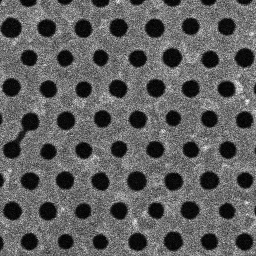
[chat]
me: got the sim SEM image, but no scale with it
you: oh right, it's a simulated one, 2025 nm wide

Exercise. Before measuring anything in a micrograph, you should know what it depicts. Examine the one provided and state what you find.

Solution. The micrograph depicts a regular array of holes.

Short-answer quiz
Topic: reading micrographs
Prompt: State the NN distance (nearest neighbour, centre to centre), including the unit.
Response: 34.4 pixels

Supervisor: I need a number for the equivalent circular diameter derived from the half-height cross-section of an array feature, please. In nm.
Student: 143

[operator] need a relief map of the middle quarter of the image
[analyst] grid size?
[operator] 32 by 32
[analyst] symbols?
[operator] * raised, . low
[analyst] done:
.*******..*******...******...***
********************************
********************************
********************************
****..******...******....*****..
***....****.....*****....*****..
***....****.....*****....****...
***....*****....*****....*****..
*************.*****************.
********************************
********************************
*********.*****************.****
..******...******...******...***
...****.....****.....****....***
...*****....****.....*****...***
..******...******...******..****
.*******************************
********************************
********************************
****.********..*******..*******.
***....*****....*****....*****..
***....*****....****.....*****..
***....*****...******....*****..
****..****************..*******.
********************************
********************************
********************************
..******...*****....******...***
...****....*****.....****.....**
...****....*****.....****.....**
..*****....*****....*****....***
.********..******...******..****